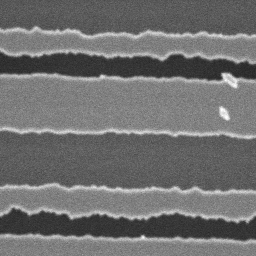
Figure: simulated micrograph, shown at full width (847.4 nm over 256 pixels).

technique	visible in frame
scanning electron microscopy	lines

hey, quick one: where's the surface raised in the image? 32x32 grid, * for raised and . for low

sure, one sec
................................
................................
................................
................................
********************************
********************************
********************************
.............................***
................................
********....................*...
********************************
********************************
********************************
********************************
********************************
********************************
..***.*******.******************
................................
................................
................................
................................
................................
................................
********.****......*.*..*.......
********************************
********************************
*..**.**************************
............................**..
................................
*****.**........................
********************************
********************************